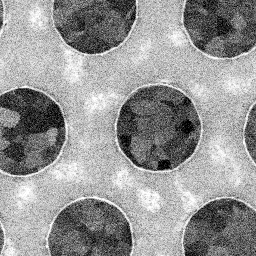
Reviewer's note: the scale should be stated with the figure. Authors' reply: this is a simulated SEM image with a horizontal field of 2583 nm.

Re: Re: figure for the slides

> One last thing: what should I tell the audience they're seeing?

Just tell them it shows raised bodies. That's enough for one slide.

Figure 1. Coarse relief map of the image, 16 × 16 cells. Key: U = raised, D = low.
DDDUUUUUUDDUUUUU
DDDUUUUUDDDUUUUU
DDDDUUUUDDDDUUUU
DDDDDDDDDDDDDUUD
DDDDDDDDDDDDDDDD
DUDDDDDDDUUDDDDD
UUUUDDDDUUUUDDDD
UUUUDDDUUUUUUDDU
UUUUDDDUUUUUUDDU
UUUUDDDDUUUUDDDU
UUUDDDDDDUUDDDDD
DDDDDDDDDDDDDDDD
DDDDDUUDDDDDDUUD
DDDDUUUUDDDDUUUU
DDDUUUUUDDDUUUUU
DDDUUUUUDDDUUUUU